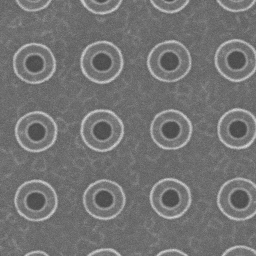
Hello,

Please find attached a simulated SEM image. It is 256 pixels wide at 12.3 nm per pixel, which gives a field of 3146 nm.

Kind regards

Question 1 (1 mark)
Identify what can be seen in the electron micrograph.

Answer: a regular array of ring-shaped raised bodies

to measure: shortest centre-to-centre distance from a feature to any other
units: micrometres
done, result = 0.825